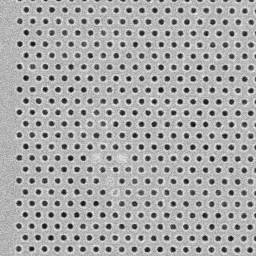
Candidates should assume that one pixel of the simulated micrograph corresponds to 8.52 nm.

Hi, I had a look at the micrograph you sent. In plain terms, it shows a regular array of holes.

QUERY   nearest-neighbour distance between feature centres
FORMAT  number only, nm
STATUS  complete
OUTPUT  107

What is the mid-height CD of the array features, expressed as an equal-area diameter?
57.7 nm